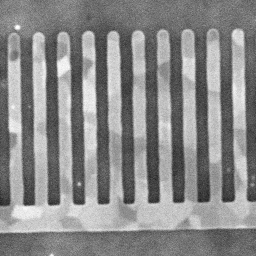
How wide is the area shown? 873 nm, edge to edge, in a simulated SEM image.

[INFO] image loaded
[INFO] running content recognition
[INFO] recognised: groups of lines, slits or small figures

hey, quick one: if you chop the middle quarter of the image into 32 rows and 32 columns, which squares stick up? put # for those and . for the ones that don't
#....###...###...###....##....##
##...###...###...###....##....##
##...###...###...###....##....##
##...###...###...###....##....##
##...###...###...###....##....##
##...###...###...###....##....##
##...###...###...###....##....##
##...###...###...###....##....##
##...###...###...###....##....##
##...###...###...###....###...##
##...###...###...###....###...##
##...###...###...###....###...##
#....###...###...###....###...##
#....###...###...###....###...##
##...###...###...###....###...##
##...###...###...###....###...##
##...###...###....##....###...##
##...###....##....##....###...##
##...###....##....##....###...##
##...###....##....##....###...##
##...###....##....##....###...##
##...###....##....##....###...##
##...###....##....##....###...##
##...###....##....##....###...##
##...###....##....##....###...##
##...###....##....##....###...##
##...###....##....##....###...##
##...###....##....###...###...##
##...###....##....###...###...##
##...###....##....###...###...##
##...###....###...###...###...##
##...###....###...###...###...##